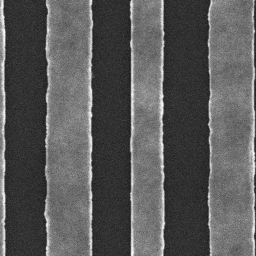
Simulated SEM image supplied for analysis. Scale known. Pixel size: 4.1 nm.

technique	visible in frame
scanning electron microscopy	lines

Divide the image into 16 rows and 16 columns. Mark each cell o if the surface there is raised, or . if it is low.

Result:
...ooo..oo...ooo
...ooo..oo...ooo
...ooo..oo...ooo
...ooo..oo...ooo
...ooo..oo...ooo
...ooo..oo...ooo
...ooo..oo...ooo
...ooo..oo...ooo
...ooo..oo...ooo
...ooo..oo...ooo
...ooo..oo...ooo
...ooo..oo...ooo
...ooo..oo...ooo
...ooo..oo...ooo
...ooo..oo...ooo
...ooo..oo...ooo